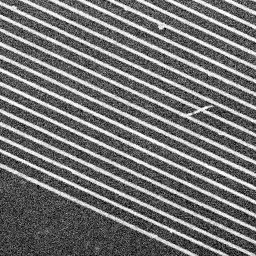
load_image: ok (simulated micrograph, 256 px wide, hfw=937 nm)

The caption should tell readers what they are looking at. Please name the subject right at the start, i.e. parallel lines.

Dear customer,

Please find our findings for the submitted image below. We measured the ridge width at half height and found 0.0108 µm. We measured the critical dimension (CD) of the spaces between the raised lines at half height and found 0.0352 micrometres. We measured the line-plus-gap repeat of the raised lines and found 0.0448 µm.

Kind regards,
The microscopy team